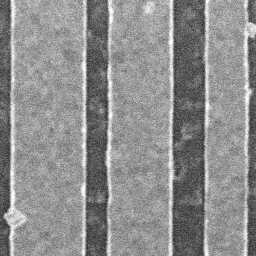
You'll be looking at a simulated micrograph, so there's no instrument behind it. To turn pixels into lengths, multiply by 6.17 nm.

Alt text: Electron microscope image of one or a few lines or trenches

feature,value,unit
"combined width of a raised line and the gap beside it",89.1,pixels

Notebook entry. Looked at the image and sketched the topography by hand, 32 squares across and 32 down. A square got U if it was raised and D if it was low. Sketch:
DUUUUUUUUUUDDDUUUUUUUDDDDDUUUUUD
DDUUUUUUUUUDDDUUUUUUUDDDDDUUUUUD
DDUUUUUUUUUDDDUUUUUUUDDDDDUUUUUD
DDUUUUUUUUUDDDUUUUUUUDDDDDUUUUUU
DDUUUUUUUUUDDDUUUUUUUDDDDDUUUUUD
DDUUUUUUUUUDDDUUUUUUUUDDDDUUUUUD
DDUUUUUUUUUDDDUUUUUUUDDDDDUUUUUD
DDUUUUUUUUUDDDUUUUUUUDDDDDUUUUUD
DDUUUUUUUUUDDDUUUUUUUUDDDDUUUUUD
DDUUUUUUUUUDDDUUUUUUUUDDDDUUUUUD
DDUUUUUUUUUDDDUUUUUUUUDDDDUUUUUD
DUUUUUUUUUUDDDUUUUUUUUDDDDUUUUUD
DUUUUUUUUUUDDDUUUUUUUUDDDDUUUUUD
DDUUUUUUUUUDDDUUUUUUUUDDDDUUUUUD
DDUUUUUUUUUDDDUUUUUUUDDDDDUUUUUD
DDUUUUUUUUUDDDUUUUUUUDDDDDUUUUUD
DDUUUUUUUUUDDDUUUUUUUDDDDDUUUUUD
DDUUUUUUUUUDDDUUUUUUUDDDDDUUUUUD
DDUUUUUUUUUDDDUUUUUUUDDDDDUUUUUD
DDUUUUUUUUUDDUUUUUUUUDDDDDUUUUUD
DDUUUUUUUUUDDUUUUUUUUDDDDDUUUUUD
DUUUUUUUUUUDDDUUUUUUUDDDDDUUUUUD
DUUUUUUUUUUDDDUUUUUUUDDDDDUUUUUD
DUUUUUUUUUUDDDUUUUUUUDDDDDUUUUUD
DDUUUUUUUUUDDDUUUUUUUDDDDDUUUUUD
DUUUUUUUUUUDDDUUUUUUUDDDDDUUUUUD
DUUUUUUUUUUDDDUUUUUUUDDDDDUUUUUD
DUUUUUUUUUUDDDUUUUUUUDDDDDUUUUUD
DUUUUUUUUUUDDDUUUUUUUDDDDDUUUUUD
DUUUUUUUUUUDDDUUUUUUUDDDDDUUUUUD
DUUUUUUUUUUDDDUUUUUUUDDDDDUUUUUD
DUUUUUUUUUUDDDUUUUUUUDDDDDUUUUUD